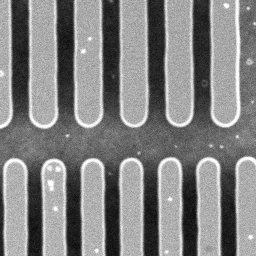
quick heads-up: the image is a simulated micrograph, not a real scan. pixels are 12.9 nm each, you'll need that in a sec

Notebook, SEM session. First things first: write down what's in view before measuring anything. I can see groups of lines, slits or small figures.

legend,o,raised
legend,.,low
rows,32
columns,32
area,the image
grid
o...ooo..oooo..ooo...ooo..oooo..
o...ooo..oooo..ooo...ooo..oooo..
o...ooo..oooo..ooo...ooo..oooo..
o...ooo..oooo..ooo...ooo..oooo..
o...ooo..oooo..ooo...ooo..oooo..
o...ooo..oooo..ooo...ooo..oooo..
o...ooo..oooo..ooo...ooo..oooo..
o...ooo..oooo..ooo...ooo..oooo..
o...ooo..oooo..ooo...ooo..oooo..
o...ooo..oooo..ooo...ooo..oooo..
o...ooo..oooo..oooo..ooo..oooo..
o...ooo..oooo..oooo..ooo..oooo..
o...ooo..oooo..oooo..ooo..oooo..
o...ooo..oooo..ooo...ooo..oooo..
o...ooo...ooo..ooo...ooo..oooo..
o...ooo...oo....oo....o....oo...
................................
................................
................................
................................
.oo...oo...oo..ooo..oo...oo...oo
.oo..ooo..ooo..ooo..ooo..oo...oo
.oo..ooo..ooo..ooo..ooo..oo...oo
.oo..ooo..ooo..ooo..ooo..oo...oo
.oo..ooo..ooo..ooo..ooo..oo...oo
.oo..ooo..ooo..ooo..ooo..oo...oo
.oo..ooo..ooo..ooo..ooo..oo...oo
.oo..ooo..ooo..ooo..ooo..oo...oo
.oo..ooo..ooo..ooo..ooo..oo...oo
.oo..ooo..ooo..ooo..ooo..oo...oo
.oo..ooo..ooo..ooo..ooo..oo...oo
.oo..ooo..ooo..ooo..ooo..oo...oo